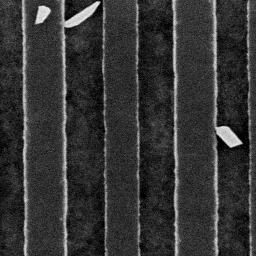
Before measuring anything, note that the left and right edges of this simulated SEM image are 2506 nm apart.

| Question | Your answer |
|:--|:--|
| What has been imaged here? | lines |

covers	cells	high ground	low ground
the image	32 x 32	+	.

...+++++.....++++.....+++++....+
...+++++..++.++++.....+++++....+
...+++++.+...++++.....+++++....+
...+++++.....++++.....+++++....+
...+++++.....++++.....+++++....+
...+++++.....++++.....+++++....+
...+++++.....++++.....+++++....+
...+++++.....++++.....+++++....+
...+++++.....++++.....+++++....+
...+++++.....++++.....+++++....+
...+++++.....++++.....+++++....+
...+++++.....++++.....+++++....+
...+++++.....++++.....+++++....+
...+++++.....++++.....+++++....+
...+++++.....++++.....+++++....+
...+++++.....++++.....+++++....+
...+++++.....++++.....+++++++..+
...+++++.....++++.....+++++.++.+
...+++++.....++++.....+++++....+
...+++++.....++++.....+++++....+
...+++++.....++++.....+++++....+
...+++++.....++++.....+++++....+
...+++++.....++++.....+++++....+
...+++++.....++++.....+++++....+
...+++++.....++++.....+++++....+
...+++++.....++++.....+++++....+
...+++++.....++++.....+++++....+
...+++++.....++++.....+++++....+
...+++++.....++++.....+++++....+
...+++++.....++++.....+++++....+
...+++++.....++++.....+++++....+
...+++++.....++++.....+++++....+